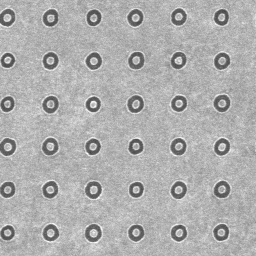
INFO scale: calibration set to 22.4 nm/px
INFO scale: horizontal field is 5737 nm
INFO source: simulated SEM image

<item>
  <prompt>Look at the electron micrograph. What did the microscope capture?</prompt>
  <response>a regular array of ring-shaped grooves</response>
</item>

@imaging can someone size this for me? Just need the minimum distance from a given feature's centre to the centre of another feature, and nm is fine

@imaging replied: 953